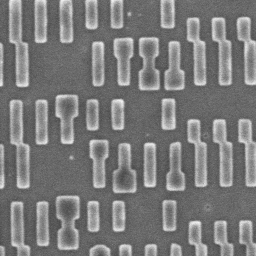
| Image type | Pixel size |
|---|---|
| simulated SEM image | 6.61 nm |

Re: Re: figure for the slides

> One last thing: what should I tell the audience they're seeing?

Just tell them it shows wiring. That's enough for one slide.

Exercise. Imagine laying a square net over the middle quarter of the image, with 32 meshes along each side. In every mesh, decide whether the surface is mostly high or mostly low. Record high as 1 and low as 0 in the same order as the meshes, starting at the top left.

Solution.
00000001110000110000110000111000
00000001110000110001111000111000
00000001110000110001111101111100
00000001110000110001111101111100
00000001110000110001111101111100
00000000000000000001111101111100
00000000000000000000000000000000
00000000000000000000000000000000
11100000000000000000000000000000
11100011000011100000000001110000
11100011000011100000000001110000
11100011000011100000000001110000
11100011000011100000000001110000
11000011000011100000000001110000
11000011000011100000000001110001
11000011000011100000000001110001
11000000000000000000000000000001
11000000000000000000000000000001
11000000000000000000000000000001
11000001111000000000000000000000
00000001111000110000111000011000
00000001111000110000111000011000
00000001111000111000111000011000
00000001111000111000111000011000
00000001110000111000111000011000
00000001110000111000111000011000
00000001110001111000111000011000
00000001110011111100111000111100
00000001110011111100111000111100
00000001110011111100111000111100
00000001110011111100111000111100
00000000000011111100000000000000